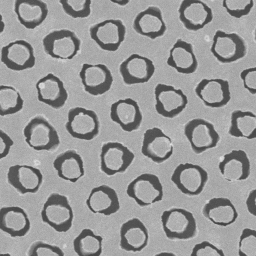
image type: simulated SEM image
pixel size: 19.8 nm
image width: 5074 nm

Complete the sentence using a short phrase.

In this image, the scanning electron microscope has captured a regular array of ring-shaped grooves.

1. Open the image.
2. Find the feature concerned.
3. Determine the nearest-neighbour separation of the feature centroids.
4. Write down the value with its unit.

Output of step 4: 854 nm